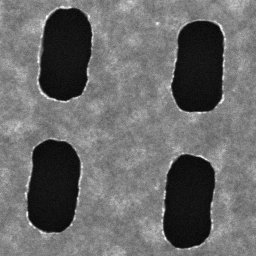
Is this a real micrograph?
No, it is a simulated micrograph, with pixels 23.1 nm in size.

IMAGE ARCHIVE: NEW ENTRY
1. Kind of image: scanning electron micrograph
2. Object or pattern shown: holes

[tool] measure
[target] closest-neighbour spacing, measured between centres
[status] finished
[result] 3080 nm